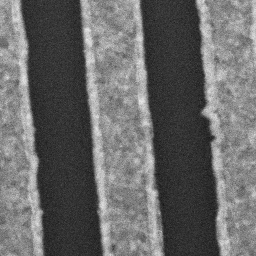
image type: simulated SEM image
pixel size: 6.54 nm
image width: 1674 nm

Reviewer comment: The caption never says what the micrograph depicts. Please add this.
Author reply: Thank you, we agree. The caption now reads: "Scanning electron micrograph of one or a few lines or trenches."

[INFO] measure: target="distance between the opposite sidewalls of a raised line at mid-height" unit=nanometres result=331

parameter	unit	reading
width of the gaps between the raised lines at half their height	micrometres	0.441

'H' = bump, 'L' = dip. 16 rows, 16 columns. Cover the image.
HLLLLHHHHLLLLHHH
HLLLLHHHHLLLLHHH
HLLLLLHHHLLLLHHH
HLLLLLHHHLLLLHHH
HLLLLLHHHLLLLHHH
HLLLLLHHHLLLLHHH
HHLLLLHHHLLLLHHH
HHLLLLHHHLLLLHHH
HHLLLLHHHLLLLLHH
HHLLLLHHHLLLLLHH
HHLLLLHHHLLLLLHH
HHLLLLHHHLLLLLHH
HHLLLLHHHLLLLLHH
HHLLLLHHHHLLLLHH
HHLLLLLHHHLLLLHH
HHLLLLLHHHLLLLHH